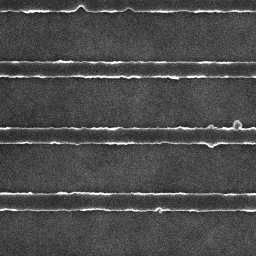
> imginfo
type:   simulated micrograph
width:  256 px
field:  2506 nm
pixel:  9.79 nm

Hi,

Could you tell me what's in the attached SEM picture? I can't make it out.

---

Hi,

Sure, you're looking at one or a few lines or trenches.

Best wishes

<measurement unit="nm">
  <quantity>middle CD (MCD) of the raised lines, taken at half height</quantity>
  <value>158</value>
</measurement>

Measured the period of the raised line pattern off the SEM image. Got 648 nanometres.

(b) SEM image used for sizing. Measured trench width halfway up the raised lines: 488 nanometers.